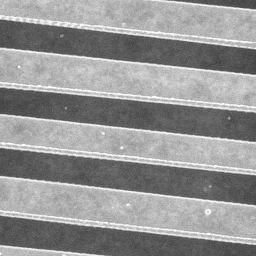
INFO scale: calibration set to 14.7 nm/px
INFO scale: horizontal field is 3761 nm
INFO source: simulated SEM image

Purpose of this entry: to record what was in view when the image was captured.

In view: lines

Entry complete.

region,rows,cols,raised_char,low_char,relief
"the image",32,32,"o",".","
ooooooooooooooooooooooooo.......
oooooooooooooooooooooooooooooooo
.ooooooooooooooooooooooooooooooo
..........oooooooooooooooooooooo
..................oooooooooooooo
...........................ooooo
oooo............................
oooooooooooooo..................
ooooooooooooooooooooooo.........
oooooooooooooooooooooooooooooooo
oooooooooooooooooooooooooooooooo
.......ooooooooooooooooooooooooo
.................ooooooooooooooo
...........................ooooo
o...............................
ooooooooooo.....................
ooooooooooooooooooo.............
ooooooooooooooooooooooooooooo...
.ooooooooooooooooooooooooooooooo
..........oooooooooooooooooooooo
....................oooooooooooo
............................oooo
oooo............................
oooooooooooo....................
ooooooooooooooooooooo...........
oooooooooooooooooooooooooooooo..
oooooooooooooooooooooooooooooooo
......oooooooooooooooooooooooooo
..............oooooooooooooooooo
.......................ooooooooo
...............................o
ooooooo.........................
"